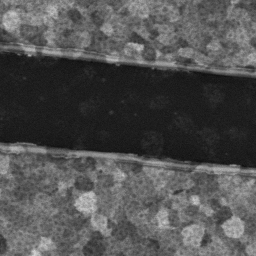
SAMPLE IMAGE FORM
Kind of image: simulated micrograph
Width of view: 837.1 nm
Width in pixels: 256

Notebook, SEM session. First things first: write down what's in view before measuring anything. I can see one or a few lines or trenches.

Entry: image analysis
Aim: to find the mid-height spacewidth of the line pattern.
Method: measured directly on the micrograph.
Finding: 0.321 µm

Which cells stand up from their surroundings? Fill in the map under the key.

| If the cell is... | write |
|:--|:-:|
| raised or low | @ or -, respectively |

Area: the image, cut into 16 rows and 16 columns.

@@@@@@@@@@@@@@@@
@@@@@@@@@@@@@@@@
@@@@@@@@@@@@@@@@
-----@@@@@@@@@@@
---------------@
----------------
----------------
----------------
----------------
@@@@------------
@@@@@@@@@@@@@---
@@@@@@@@@@@@@@@@
@@@@@@@@@@@@@@@@
@@@@@@@@@@@@@@@@
@@@@@@@@@@@@@@@@
@@@@@@@@@@@@@@@@